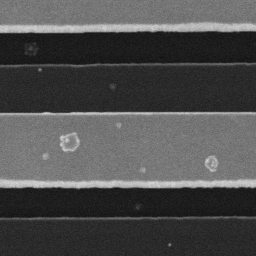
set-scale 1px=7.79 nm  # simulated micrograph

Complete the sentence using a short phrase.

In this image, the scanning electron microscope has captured lines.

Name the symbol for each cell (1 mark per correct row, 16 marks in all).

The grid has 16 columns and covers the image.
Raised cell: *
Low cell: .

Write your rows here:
****************
****************
................
................
................
................
................
****************
****************
****************
****************
****************
................
................
................
................